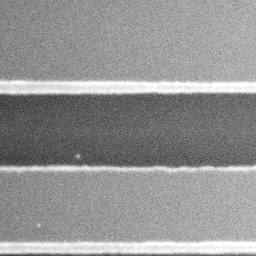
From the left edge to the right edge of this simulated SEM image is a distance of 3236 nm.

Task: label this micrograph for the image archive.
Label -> lines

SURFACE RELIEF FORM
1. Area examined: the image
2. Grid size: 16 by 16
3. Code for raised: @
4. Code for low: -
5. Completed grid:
@@@@@@@@@@@@@@@@
@@@@@@@@@@@@@@@@
@@@@@@@@@@@@@@@@
@@@@@@@@@@@@@@@@
@@@@@@@@@@@@@@@@
@@@@@@@@@@@@@@@@
----------------
----------------
----------------
----------------
----------------
@@@@@@@@@@@@@@@@
@@@@@@@@@@@@@@@@
@@@@@@@@@@@@@@@@
@@@@@@@@@@@@@@@@
@@@@@@@@@@@@@@@@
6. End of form